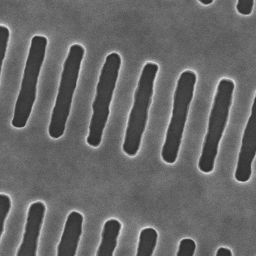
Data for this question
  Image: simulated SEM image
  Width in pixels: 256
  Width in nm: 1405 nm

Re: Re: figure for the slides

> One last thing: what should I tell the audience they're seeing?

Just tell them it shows holes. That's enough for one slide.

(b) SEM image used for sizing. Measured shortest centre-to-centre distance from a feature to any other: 209 nm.